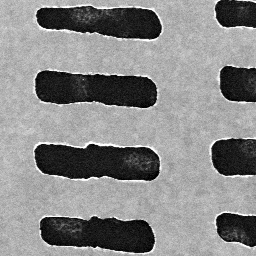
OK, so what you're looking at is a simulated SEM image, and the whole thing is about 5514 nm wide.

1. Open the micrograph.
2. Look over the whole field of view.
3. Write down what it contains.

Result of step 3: holes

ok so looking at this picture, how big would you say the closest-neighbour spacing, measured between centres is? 69.9 pixels